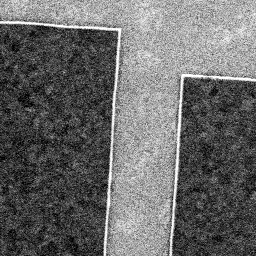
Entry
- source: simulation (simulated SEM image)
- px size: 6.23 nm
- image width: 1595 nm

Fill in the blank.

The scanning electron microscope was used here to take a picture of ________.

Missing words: one or a few lines or trenches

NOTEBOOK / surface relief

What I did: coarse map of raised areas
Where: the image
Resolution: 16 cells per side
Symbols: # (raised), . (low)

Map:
................
###.............
#######.........
#######.........
#######.........
#######....#####
#######....#####
#######....#####
#######....#####
#######....#####
#######....#####
#######....#####
#######....#####
#######....#####
#######....#####
#######....#####